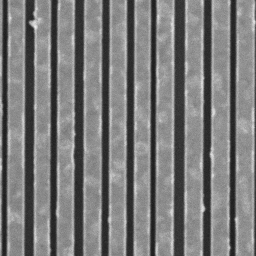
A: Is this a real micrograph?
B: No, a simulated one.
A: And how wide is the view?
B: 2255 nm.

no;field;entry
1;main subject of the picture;parallel lines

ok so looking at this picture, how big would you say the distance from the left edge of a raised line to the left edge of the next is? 0.224 micrometres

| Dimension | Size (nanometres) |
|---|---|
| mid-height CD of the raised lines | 150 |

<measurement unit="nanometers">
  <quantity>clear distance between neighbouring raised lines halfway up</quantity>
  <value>71.6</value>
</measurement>